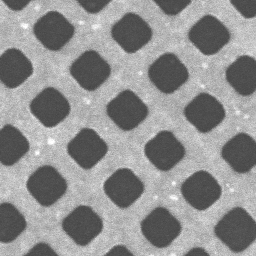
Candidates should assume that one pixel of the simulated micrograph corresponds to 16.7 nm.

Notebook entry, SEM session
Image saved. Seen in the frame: a regular array of holes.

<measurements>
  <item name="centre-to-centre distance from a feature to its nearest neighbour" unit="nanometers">902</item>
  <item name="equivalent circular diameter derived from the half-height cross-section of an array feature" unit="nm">656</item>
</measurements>